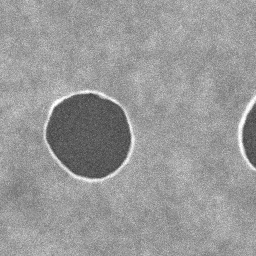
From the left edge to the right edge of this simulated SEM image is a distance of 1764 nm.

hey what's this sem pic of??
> holes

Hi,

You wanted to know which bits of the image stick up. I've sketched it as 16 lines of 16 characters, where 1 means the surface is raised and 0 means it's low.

1111111111111111
1111111111111111
1111111111111111
1111111111111111
1111111111111111
1111111111111111
1111000111111111
1110000011111110
1110000011111110
1110000011111110
1111000111111111
1111111111111111
1111111111111111
1111111111111111
1111111111111111
1111111111111111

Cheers